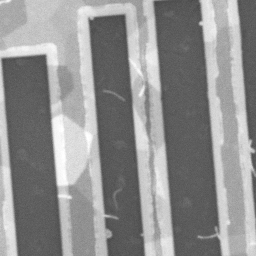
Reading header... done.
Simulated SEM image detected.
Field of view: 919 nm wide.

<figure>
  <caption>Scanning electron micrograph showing one or a few lines or trenches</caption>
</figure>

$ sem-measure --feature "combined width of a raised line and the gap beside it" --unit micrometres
0.279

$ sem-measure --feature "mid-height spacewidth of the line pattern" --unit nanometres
193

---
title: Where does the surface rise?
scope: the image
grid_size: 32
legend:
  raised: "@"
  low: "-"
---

@@@@@@@@@@@@@@@@@@@-------@@@---
@@@@@@@@@@@-----@@@-------@@@---
@@@@@@@@@@------@@@-------@@@---
@@@@@@@@@@@-----@@@-------@@@---
@@@@@@@@@@@-----@@@-------@@@---
@@@@@@@@@@@------@@-------@@@@--
@@----@@@@@------@@-------@@@@--
------@@@@@------@@-------@@@@--
-------@@@@------@@-------@@@@--
-------@@@@------@@--------@@@--
-------@@@@------@@--------@@@--
-------@@@@------@@@-------@@@--
-------@@@@------@@@-------@@@--
-------@@@@------@@@-------@@@--
-------@@@@------@@@-------@@@--
-------@@@@------@@@-------@@@--
-------@@@@@-----@@@-------@@@--
-------@@@@@------@@-------@@@@-
-------@@@@@------@@-------@@@@-
@------@@@@@------@@-------@@@@-
@-------@@@@------@@-------@@@@-
@-------@@@@------@@-------@@@@-
@-------@@@@------@@--------@@@-
@-------@@@@------@@@-------@@@-
@-------@@@@------@@@-------@@@-
@-------@@@@------@@@-------@@@-
@-------@@@@------@@@-------@@@-
@-------@@@@------@@@-------@@@-
@-------@@@@@-----@@@-------@@@-
@-------@@@@@------@@-------@@@-
@-------@@@@@------@@-------@@@@
@@------@@@@@------@@-------@@@@